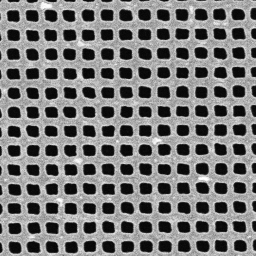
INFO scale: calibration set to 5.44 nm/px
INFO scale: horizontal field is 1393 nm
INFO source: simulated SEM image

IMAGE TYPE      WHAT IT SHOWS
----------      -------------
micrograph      a regular array of holes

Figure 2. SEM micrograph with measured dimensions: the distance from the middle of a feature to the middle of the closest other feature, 101 nanometers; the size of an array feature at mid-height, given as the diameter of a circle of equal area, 0.0689 µm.